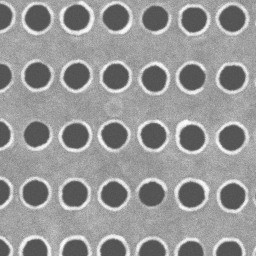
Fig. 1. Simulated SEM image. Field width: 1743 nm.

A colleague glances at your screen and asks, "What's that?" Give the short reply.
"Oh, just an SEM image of a regular array of holes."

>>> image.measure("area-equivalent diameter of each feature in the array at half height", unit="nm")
176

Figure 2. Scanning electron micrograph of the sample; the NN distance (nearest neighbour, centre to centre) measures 264 nm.